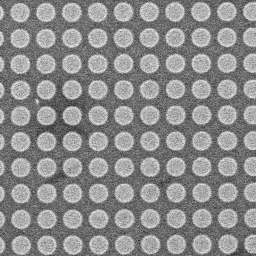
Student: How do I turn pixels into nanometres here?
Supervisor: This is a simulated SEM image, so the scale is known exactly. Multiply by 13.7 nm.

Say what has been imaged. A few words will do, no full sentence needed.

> an array of small figures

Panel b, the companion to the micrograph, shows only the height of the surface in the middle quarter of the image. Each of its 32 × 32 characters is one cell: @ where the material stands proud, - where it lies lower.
@@@@--@@@@@--@@@@--@@@@@--@@@@--
@@@@---@@@---@@@----@@@---@@@---
--------------------------------
--------------------------------
-@@----@@@----@@----@@@----@@---
@@@@--@@@@---@@@@--@@@@---@@@@--
@@@@--@@@@@--@@@@--@@@@@--@@@@--
@@@@--@@@@---@@@@--@@@@---@@@@--
-@@----@@-----@@-----@-----@----
--------------------------------
--------------------------------
@@@@---@@@---@@@@---@@@---@@@@--
@@@@--@@@@@--@@@@--@@@@@--@@@@--
@@@@--@@@@@--@@@@--@@@@@--@@@@--
@@@@---@@@---@@@----@@@---@@@---
--------------------------------
--------------------------------
-@@----@@@----@@----@@@----@@---
@@@@---@@@@--@@@@--@@@@@--@@@@--
@@@@--@@@@@--@@@@--@@@@@--@@@@--
@@@@---@@@---@@@@---@@@---@@@@--
-@@-----@-----@@-----@----------
--------------------------------
--------------------------------
@@@@---@@@---@@@@---@@@---@@@@--
@@@@--@@@@@--@@@@--@@@@@--@@@@--
@@@@--@@@@@--@@@@--@@@@@--@@@@--
-@@@---@@@----@@----@@@----@@---
--------------------------------
--------------------------------
-@@----@@@----@@----@@@----@@---
@@@@--@@@@@--@@@@--@@@@@--@@@@--